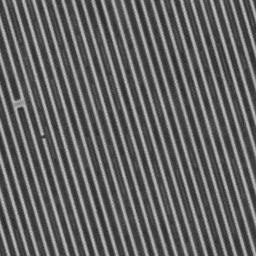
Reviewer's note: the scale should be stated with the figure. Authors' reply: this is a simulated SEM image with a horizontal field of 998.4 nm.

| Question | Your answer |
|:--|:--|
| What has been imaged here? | parallel lines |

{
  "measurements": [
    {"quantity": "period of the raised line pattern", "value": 37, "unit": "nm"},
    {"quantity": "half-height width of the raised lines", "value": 2.64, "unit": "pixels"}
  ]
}